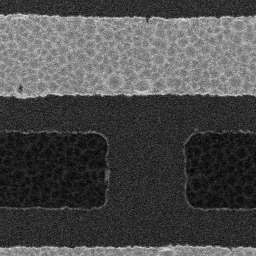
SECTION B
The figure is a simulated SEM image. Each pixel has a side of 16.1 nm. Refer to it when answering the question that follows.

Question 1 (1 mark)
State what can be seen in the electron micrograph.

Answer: one or a few lines or trenches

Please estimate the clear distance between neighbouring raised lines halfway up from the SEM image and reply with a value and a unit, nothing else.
619 nm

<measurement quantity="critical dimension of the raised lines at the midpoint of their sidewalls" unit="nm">1120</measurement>